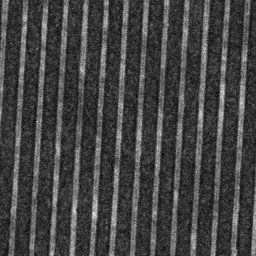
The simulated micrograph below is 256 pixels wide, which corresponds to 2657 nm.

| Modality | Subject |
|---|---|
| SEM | parallel lines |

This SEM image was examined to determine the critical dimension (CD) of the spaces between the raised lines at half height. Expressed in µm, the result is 0.161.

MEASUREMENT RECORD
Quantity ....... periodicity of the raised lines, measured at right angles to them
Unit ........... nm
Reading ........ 209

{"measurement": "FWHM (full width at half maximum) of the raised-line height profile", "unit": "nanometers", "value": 50.5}